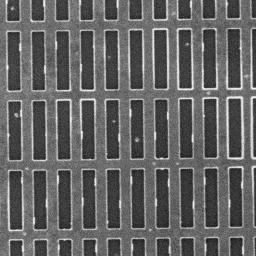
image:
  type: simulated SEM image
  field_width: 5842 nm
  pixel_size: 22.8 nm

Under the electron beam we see groups of lines, slits or small figures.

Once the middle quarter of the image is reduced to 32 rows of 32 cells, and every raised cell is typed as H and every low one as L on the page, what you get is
LLHHLLLLHHLLLLHHLLLLHHLLLLHHLLLL
LLHHLLLLHHLLLLHHLLLLHHLLLLHHLLLL
LLHHLLLLHHLLLLHHLLLLHHLLLLHHLLLL
LLHHLLLLHHLLLLHHLLLLHHLLLLHHLLLL
LLHHLLLLHHLLLLHHLLLLHHLLLLHHLLLL
LLHHLLLLHHLLLLHHLLLLHHLLLLHHLLLL
LHHHHLLHHHHHHHHHHHHHHHHHHHHHHHHH
HHHHHHHHHHHHHHHHHHHHHHHHHHHHHHHH
HHHHHHHHHHHHHHHHHHHHHHHHHHHHHHHH
LLHHLLLLHHLLLLHHLLLLHHLLLLHHHLLL
LLHHLLLLHHLLLLHHLLLLHHLLLLHHHLLL
LLHHLLLLHHLLLLHHLLLLHHLLLLHHHLLL
LLHHLLLLHHLLLLHHLLLLHHHLLLHHHLLL
LLHHLLLLHHLLLLHHLLLLHHHLLLHHHLLL
LLHHLLLLHHLLLLHHLLLLHHHLLLHHHLLL
LLHHLLLLHHLLLLHHLLLLHHHLLLHHHLLL
LLHHLLLLHHLLLLHHLLLLHHHLLLHHHLLL
LLHHLLLLHHLLLLHHLLLLHHHLLLHHHLLL
LLHHLLLLHHLLLLHHLLLLHHHLLLHHHLLL
LLHHLLLLHHLLLLHHLLLLHHHLLLHHHLLL
LLHHLLLLHHLLLLHHLLLLHHHLLLHHHLLL
LLHHLLLLHHLLLLHHLLLLHHHLLLHHHLLL
LLHHLLLLHHLLLLHHLLLLHHHLLLHHHLLL
LLHHHLLLHHHLLLHHHLLLHHHLLLHHHLLL
HHHHHHHHHHHHHHHHHHHHHHHHHHHHHHHH
HHHHHHHHHHHHHHHHHHHHHHHHHHHHHHHH
LHHHHLLHHHHLLLHHHLLLHHHLLLHHHLLL
LLHHLLLLHHLLLLHHHLLLHHHLLLHHHLLL
LLHHHLLLHHLLLLHHHLLLHHHLLLHHHLLL
LLHHHLLLHHLLLLHHHLLLHHHLLLHHHLLL
LLHHHLLLHHLLLLHHHLLLHHHLLLHHHLLL
LLHHHLLLHHLLLLHHHLLLHHHLLLHHHLLL